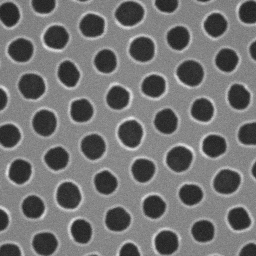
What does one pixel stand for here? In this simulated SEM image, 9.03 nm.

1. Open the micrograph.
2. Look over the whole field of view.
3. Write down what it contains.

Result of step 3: a regular array of holes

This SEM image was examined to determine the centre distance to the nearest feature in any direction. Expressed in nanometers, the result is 340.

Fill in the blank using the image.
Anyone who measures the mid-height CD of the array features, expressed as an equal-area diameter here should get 223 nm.